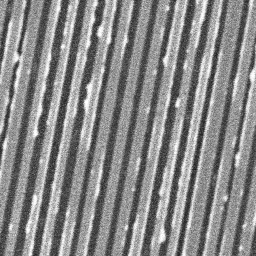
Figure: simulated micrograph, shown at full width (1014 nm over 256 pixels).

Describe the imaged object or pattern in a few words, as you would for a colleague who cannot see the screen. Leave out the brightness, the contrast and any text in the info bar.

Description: parallel lines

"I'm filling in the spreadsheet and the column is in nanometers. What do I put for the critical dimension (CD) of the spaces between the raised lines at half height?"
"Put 33.1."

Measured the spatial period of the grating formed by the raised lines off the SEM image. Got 70.4 nanometers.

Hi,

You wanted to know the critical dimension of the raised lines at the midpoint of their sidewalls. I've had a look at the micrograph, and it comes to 36.9 nm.